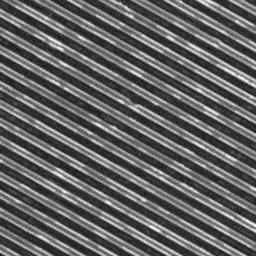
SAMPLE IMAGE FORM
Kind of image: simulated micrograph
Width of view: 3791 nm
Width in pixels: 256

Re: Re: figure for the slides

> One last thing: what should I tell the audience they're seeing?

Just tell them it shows parallel lines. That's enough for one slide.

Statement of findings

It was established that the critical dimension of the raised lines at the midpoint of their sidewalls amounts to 6.43 px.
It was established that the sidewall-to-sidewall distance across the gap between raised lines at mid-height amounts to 9.28 px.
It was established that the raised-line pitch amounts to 234 nm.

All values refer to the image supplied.